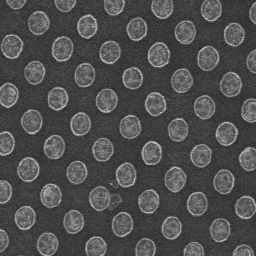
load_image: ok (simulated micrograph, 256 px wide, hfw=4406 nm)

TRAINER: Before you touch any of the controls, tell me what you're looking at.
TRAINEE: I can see a regular array of raised bodies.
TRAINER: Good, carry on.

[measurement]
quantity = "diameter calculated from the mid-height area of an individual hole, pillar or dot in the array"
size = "374 nanometres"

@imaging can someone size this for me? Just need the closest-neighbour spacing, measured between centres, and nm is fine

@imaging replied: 585